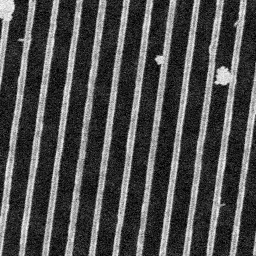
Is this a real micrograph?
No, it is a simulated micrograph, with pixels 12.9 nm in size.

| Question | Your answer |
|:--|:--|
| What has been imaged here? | parallel lines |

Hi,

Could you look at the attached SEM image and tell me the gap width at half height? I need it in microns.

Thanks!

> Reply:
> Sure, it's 0.242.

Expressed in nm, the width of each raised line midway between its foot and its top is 64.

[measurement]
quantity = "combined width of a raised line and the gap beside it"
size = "300 nm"